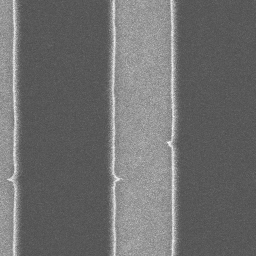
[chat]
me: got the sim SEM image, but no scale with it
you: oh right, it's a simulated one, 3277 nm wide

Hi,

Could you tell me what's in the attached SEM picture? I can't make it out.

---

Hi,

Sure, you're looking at one or a few lines or trenches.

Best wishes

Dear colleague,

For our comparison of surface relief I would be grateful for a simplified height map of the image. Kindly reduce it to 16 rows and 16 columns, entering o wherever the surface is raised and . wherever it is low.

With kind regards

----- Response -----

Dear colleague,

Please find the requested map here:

.oooooo....ooooo
.oooooo....ooooo
.oooooo....ooooo
.oooooo....ooooo
.oooooo....ooooo
.oooooo....ooooo
.oooooo....ooooo
.oooooo....ooooo
.oooooo....ooooo
.oooooo....ooooo
.oooooo....ooooo
.oooooo....ooooo
.oooooo....ooooo
.oooooo....ooooo
.oooooo....ooooo
.oooooo....ooooo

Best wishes